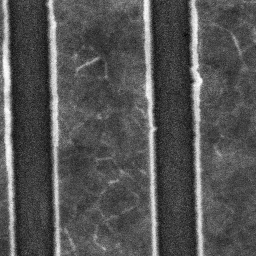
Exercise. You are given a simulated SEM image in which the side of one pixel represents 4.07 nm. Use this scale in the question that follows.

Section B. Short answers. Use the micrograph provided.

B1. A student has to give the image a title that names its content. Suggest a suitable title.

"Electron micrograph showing one or a few lines or trenches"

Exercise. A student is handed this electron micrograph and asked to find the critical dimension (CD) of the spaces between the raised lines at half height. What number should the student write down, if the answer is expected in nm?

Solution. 186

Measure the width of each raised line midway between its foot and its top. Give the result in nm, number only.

393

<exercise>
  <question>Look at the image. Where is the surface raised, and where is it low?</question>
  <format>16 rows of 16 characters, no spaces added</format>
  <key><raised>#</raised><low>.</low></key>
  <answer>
...######...####
...######...####
...######...####
...######...####
#..######...####
#..######...####
#..######...####
#..######...####
#..######...####
#..######...####
#...######..####
#...######..####
#...######..####
#...######..####
#...######..####
#...######...###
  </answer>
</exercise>